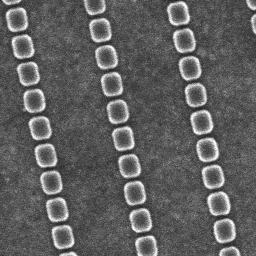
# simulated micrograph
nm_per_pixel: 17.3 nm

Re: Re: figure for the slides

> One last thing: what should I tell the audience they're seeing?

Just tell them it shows a regular array of raised bodies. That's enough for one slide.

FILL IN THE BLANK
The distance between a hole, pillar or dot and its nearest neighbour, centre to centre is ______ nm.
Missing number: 478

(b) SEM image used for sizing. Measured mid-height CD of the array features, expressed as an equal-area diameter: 21.9 pixels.